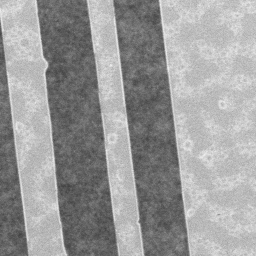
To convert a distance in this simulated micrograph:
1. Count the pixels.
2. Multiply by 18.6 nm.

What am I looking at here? one or a few lines or trenches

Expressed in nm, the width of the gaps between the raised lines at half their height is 920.